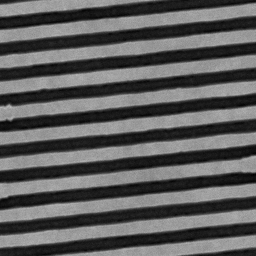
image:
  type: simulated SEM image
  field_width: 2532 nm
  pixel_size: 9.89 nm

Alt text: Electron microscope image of parallel lines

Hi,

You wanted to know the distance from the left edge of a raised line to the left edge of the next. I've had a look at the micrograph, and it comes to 0.253 microns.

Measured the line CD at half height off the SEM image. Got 129 nm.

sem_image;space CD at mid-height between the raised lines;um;0.119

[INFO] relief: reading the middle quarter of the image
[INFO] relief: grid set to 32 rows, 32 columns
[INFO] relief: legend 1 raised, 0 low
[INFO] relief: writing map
00000000000000000000011111111111
00000000000111111111111111111111
01111111111111111111111111111111
11111111111111111111111100000000
11111111111101000000000000000000
11100000000000000000000000000000
00000000000000000000000011111111
00000000000000001111111111111111
00000001111111111111111111111111
11111111111111111111111111100000
11111111111111111000000000000000
11111111110000000000000000000000
00000000000000000000000000000111
00000000000000000001111111111111
00000000000011111111111111111111
10111111111111111111111111111111
11111111111111111111110000000000
11111111111110000000000000000000
10000000000000000000000000000000
00000000000000000000001111111111
00000000000000111111111111111111
00000111111111111111111111111111
11111111111111111111111110000000
11111111111111100000000000000000
11111100000000000000000000000000
00000000000000000000000000011111
00000000000000000111111111111111
00000000001111111111111111111111
11111111111111111111111111111100
11111111111111111110000000000000
11111111111000000000000000000000
00000000000000000000000000000000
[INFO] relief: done